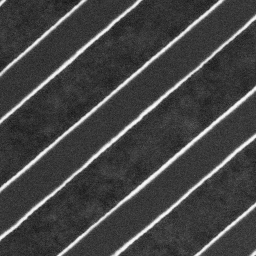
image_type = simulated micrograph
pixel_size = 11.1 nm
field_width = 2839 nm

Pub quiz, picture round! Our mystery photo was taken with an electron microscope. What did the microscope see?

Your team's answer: lines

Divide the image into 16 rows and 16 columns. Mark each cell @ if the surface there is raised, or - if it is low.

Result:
-----@@@-----@@@
----@@@-----@@@@
--@@@@-----@@@--
-@@@@-----@@@---
@@@@-----@@@----
@@-----@@@@-----
@-----@@@@-----@
-----@@@@-----@@
----@@@@----@@@@
---@@@-----@@@@-
--@@@-----@@@@--
@@@@-----@@@@---
@@@-----@@@-----
@@-----@@@-----@
@----@@@@-----@@
----@@@@-----@@@